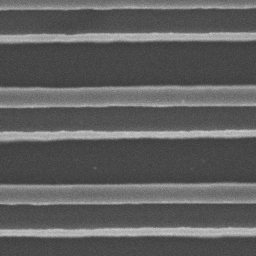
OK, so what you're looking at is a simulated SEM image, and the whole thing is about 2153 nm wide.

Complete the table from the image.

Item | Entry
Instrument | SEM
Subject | lines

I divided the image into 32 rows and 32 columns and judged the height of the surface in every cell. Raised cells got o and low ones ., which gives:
oooooooooooooooooooooooooooooooo
oooooooooooooooooooooooooooooooo
oooooooooooooooooooooooooooooooo
oooooooooooooooooooooooooooooooo
oooooooooooooooooooooooooooooooo
................................
................................
................................
................................
................................
................................
oooooooooooooooooooooooooooooooo
oooooooooooooooooooooooooooooooo
oooooooooooooooooooooooooooooooo
oooooooooooooooooooooooooooooooo
oooooooooooooooooooooooooooooooo
oooooooooooooooooooooooooooooooo
................................
................................
................................
................................
................................
................................
oooooooooooooooooooooooooooooooo
oooooooooooooooooooooooooooooooo
oooooooooooooooooooooooooooooooo
oooooooooooooooooooooooooooooooo
oooooooooooooooooooooooooooooooo
oooooooooooooooooooooooooooooooo
................................
................................
................................